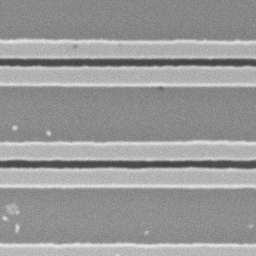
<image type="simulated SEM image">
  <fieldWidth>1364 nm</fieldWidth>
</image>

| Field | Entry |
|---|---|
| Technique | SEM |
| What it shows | lines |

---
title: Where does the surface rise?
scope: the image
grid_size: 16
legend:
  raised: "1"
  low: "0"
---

0000000000000000
0000000000000000
0000000000000000
1111111111111111
1111111111111111
0000000000000000
0000000000000000
0000000000000000
0000000000000000
1111111111111111
1111111111111111
1111111111111111
0000000000000000
0000000000000000
0000000000000000
1111111111111111